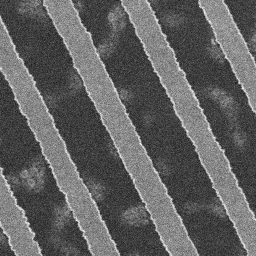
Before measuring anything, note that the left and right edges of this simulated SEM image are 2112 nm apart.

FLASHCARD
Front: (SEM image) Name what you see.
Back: one or a few lines or trenches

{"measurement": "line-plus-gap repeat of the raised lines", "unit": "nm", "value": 567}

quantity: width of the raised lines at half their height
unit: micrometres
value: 0.194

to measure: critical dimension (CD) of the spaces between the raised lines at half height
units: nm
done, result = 370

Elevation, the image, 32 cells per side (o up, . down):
......ooo......oooo......ooo....
......oooo......ooo.......ooo...
.......ooo......oooo......ooo...
o......oooo......ooo.......ooo..
o.......ooo......oooo......ooo..
oo......oooo......ooo......oooo.
oo.......ooo......oooo......ooo.
ooo......oooo......ooo.......ooo
ooo.......ooo......ooo.......ooo
.ooo......oooo......ooo.......oo
.ooo.......ooo......oooo......oo
..ooo......oooo......ooo.......o
..ooo.......ooo......oooo......o
...ooo......oooo......ooo.......
...ooo.......ooo......oooo......
....ooo......oooo......ooo......
....ooo.......ooo......ooo......
.....ooo......ooo.......ooo.....
.....ooo.......ooo......oooo....
......ooo......oooo......ooo....
......ooo.......ooo......oooo...
.......ooo......oooo......ooo...
o......ooo.......ooo......ooo...
o......oooo......oooo......ooo..
oo......ooo.......ooo......ooo..
oo.......ooo......oooo......ooo.
ooo......ooo.......ooo......ooo.
ooo.......ooo......oooo......ooo
oooo......ooo.......ooo......ooo
.ooo.......ooo......oooo......oo
.oooo......ooo......oooo......oo
..ooo......oooo......oooo......o